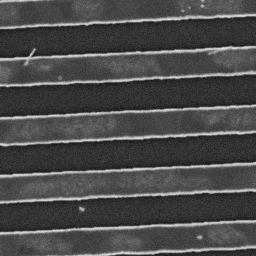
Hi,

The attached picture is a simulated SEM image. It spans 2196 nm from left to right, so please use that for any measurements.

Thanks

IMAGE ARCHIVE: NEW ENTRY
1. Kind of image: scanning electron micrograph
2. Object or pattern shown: lines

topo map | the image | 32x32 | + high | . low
++++++++++++++++++++++++++++++++
++++++++++++++++++++++++++++++++
++++++++++++++++++..............
+...............................
................................
................................
....................++++++++++++
++++++++++++++++++++++++++++++++
++++++++++++++++++++++++++++++++
++++++++++++++++++++++++++......
+++++...........................
................................
................................
..........................++++++
.......+++++++++++++++++++++++++
++++++++++++++++++++++++++++++++
++++++++++++++++++++++++++++++++
++++++++++++....................
................................
................................
...............................+
.........+++++++++++++++++++++++
++++++++++++++++++++++++++++++++
++++++++++++++++++++++++++++++++
+++++++++++++++++...............
................................
................................
................................
.............+++++++++++++++++++
++++++++++++++++++++++++++++++++
++++++++++++++++++++++++++++++++
++++++++++++++++++++............